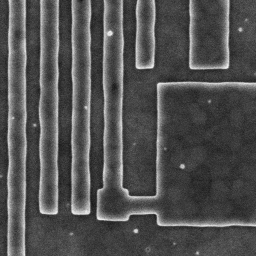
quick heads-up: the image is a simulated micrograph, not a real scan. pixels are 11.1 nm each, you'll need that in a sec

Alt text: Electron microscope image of wiring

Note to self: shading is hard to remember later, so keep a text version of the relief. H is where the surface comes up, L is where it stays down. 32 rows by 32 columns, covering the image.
LHHLLHHLLHHLLHHLLHHLLLLLHHHHHLLL
LHHLLHHLLHHLLHHLLHHLLLLLHHHHHLLL
LHHLLHHLLHHLLHHLLHHLLLLLHHHHHLLL
LHHLLHHLLHHLLHHLLHHLLLLLHHHHHLLL
LHHLLHHLLHHLLHHLLHHLLLLLHHHHHLLL
LHHLLHHLLHHLLHHLLHHLLLLLHHHHLLLL
LHHLLHHLLHHLLHHLLHHLLLLLHHHHHLLL
LHHLLHHLLHHLLHHLLHHLLLLLHHHHHLLL
LHHLLHHLLHHLLHHLLHHLLLLLHHHHLLLL
LHHLLHHLLHHLLHHLLLLLLLLLLLLLLLLL
LHHLLHHLLHHLLHHLLLLLHHHHHHHHHHHH
LHHLLHHLLHHLLHHLLLLLHHHHHHHHHHHH
LHHLLHHLLHHLLHHLLLLLHHHHHHHHHHHH
LHHLLHHLLHHLLHHLLLLLHHHHHHHHHHHH
LHHLLHHLLHHLLHHLLLLLHHHHHHHHHHHH
LHHLLHHLLHHLLHHLLLLLHHHHHHHHHHHH
LHHLLHHLLHHLLHHLLLLLHHHHHHHHHHHH
LHHLLHHLLHHLLHHLLLLLHHHHHHHHHHHH
LHHLLHHLLHHLLHHLLLLLHHHHHHHHHHHH
LHHLLHHLLHHLLHHLLLLLHHHHHHHHHHHH
LHHLLHHLLHHLLHHLLLLLHHHHHHHHHHHH
LHHLLHHLLHHLLHHLLLLLHHHHHHHHHHHH
LHHLLHHLLHHLLHHLLLLLHHHHHHHHHHHH
LHHLLHHLLHHLLHHHLLLLHHHHHHHHHHHH
LHHLLHHLLHHLHHHHHLLHHHHHHHHHHHHH
LHHLLHHLLHHLHHHHHHHHHHHHHHHHHHHH
LHHLLHHLLHHLHHHHHHHHHHHHHHHHHHHH
LHHLLLLLLLLLLHHHLLLLHHHHHHHHHHHH
LHHLLLLLLLLLLLLLLLLLLLLLLLLLLLLL
LHHLLLLLLLLLLLLLLLLLLLLLLLLLLLLL
LHHLLLLLLLLLLLLLLLLLLLLLLLLLLLLL
LHHLLLLLLLLLLLLLLLLLLLLLLLLLLLLL